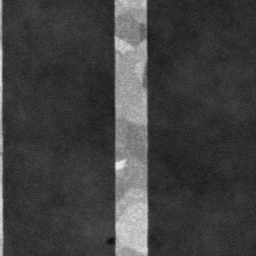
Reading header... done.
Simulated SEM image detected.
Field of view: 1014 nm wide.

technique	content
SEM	wiring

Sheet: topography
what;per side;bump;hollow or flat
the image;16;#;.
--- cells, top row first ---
.......##.......
.......##.......
.......##.......
.......##.......
.......##.......
.......##.......
.......##.......
.......##.......
.......##.......
.......##.......
.......##.......
.......##.......
.......##.......
.......##.......
.......##.......
.......##.......